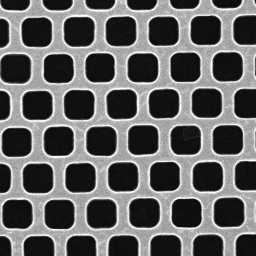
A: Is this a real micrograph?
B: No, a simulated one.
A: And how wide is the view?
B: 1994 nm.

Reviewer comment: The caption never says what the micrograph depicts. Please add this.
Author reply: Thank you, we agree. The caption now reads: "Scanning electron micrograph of a regular array of holes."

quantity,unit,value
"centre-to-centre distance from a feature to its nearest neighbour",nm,325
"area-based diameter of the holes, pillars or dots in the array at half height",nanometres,248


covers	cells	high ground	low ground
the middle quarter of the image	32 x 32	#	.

...##........###........###.....
...##........###........##......
...##........###........###.....
..####......####.......####.....
.######....######.....#######.##
################################
##....#######....######.....####
.......####.......####......####
........###.......###........###
........###.......###........###
........###.......###........###
........###.......###........###
.......####.......####......####
#......#####.....######....#####
################################
##################....######....
..####.......###.......####.....
..####.......###........###.....
..###........###........###.....
..###........###........###.....
...##........###........###.....
..####.......###.......####.....
.######.....#####.....######....
################################
##########################.#####
#......#####......####.......###
........###........##........###
........###........##........###
........###........##........###
........###........##........###
........###.......####.......###
#......#####.....######.....####